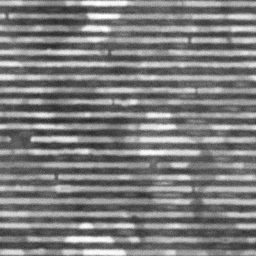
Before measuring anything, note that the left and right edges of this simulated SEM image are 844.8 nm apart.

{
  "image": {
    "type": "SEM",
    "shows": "parallel lines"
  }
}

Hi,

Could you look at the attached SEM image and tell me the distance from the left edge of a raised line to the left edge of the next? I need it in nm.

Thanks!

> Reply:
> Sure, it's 41.1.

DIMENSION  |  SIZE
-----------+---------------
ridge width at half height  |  4.36 px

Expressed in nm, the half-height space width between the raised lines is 26.4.